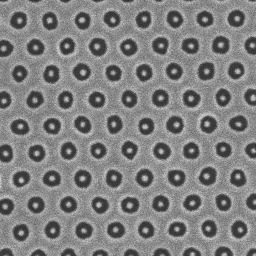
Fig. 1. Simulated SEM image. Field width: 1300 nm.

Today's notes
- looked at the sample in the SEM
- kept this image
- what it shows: a regular array of ring-shaped grooves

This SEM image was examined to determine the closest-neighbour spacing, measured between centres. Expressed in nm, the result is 150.